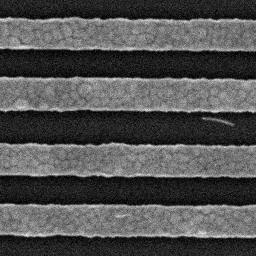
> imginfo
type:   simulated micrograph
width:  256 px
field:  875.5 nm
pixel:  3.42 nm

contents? lines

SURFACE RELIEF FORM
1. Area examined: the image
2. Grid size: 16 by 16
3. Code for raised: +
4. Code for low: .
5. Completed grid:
................
++++++++++++++++
++++++++++++++++
................
................
++++++++++++++++
++++++++++++++++
................
................
++++++++++++++++
++++++++++++++++
................
................
++++++++++++++++
++++++++++++++++
................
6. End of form